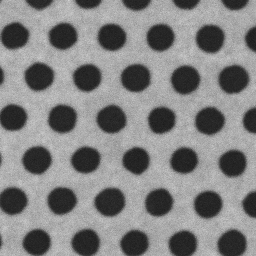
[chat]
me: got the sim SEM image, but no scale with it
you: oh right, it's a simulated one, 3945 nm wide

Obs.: a regular array of holes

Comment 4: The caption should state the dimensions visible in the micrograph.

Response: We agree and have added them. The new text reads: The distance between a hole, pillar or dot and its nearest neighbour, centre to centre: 725 nanometers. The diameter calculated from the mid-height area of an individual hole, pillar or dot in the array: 443 nanometres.